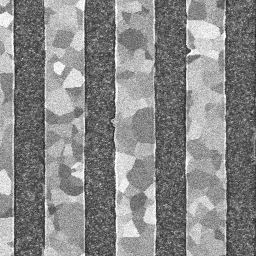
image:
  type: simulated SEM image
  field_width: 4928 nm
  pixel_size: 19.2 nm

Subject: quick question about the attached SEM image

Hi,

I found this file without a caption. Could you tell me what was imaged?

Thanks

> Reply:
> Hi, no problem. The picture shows one or a few lines or trenches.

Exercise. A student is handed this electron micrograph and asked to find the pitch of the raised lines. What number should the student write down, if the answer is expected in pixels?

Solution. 70.6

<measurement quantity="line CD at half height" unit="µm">0.756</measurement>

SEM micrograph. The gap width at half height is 609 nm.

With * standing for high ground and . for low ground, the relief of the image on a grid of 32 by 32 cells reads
**....****....*****....*****....
**....****.....****....*****....
**....****.....****....*****....
**....****.....****....*****....
**....****.....****....*****....
**....*****....****....*****....
**....*****...*****.....****....
**....*****...*****....*****....
**....*****....****....*****....
**....*****...*****....*****....
**....*****...*****....*****....
**....*****....****....*****....
**....*****...*****....*****....
**....*****...*****....*****....
**....*****...*****....*****....
**....*****...*****....*****....
**....*****...*****....*****....
**....*****...*****....*****....
**....****....*****....*****....
**....****....*****....*****....
**....****....*****....*****....
**....****....*****....*****....
**....****.....****....*****....
**....*****....****....*****....
**....****....*****....*****....
**....*****...*****....*****....
**....*****...*****....*****....
**....*****....****....*****....
**....*****....****....*****....
**....*****....****....*****....
**....*****....****....*****....
**....*****....****....*****....